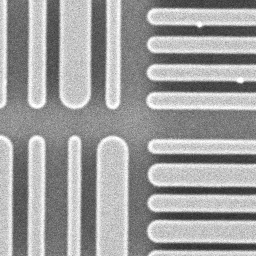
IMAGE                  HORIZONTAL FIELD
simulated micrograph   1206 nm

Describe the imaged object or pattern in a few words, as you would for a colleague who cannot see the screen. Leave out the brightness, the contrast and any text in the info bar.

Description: groups of lines, slits or small figures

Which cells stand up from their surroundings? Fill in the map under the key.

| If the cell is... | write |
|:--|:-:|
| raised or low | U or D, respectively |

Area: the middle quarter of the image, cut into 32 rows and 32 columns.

UUUUUUUDDDDUUUDDDDDDDDUUUUUUUUUU
UUUUUUUDDDDUUUDDDDDDDUUUUUUUUUUU
UUUUUUUDDDDUUUDDDDDDDUUUUUUUUUUU
UUUUUUUDDDDUUUDDDDDDDDUUUUUUUUUU
UUUUUUUDDDDUUUDDDDDDDDDDDDDDDDDD
UUUUUUUDDDDUUUDDDDDDDDDDDDDDDDDD
UUUUUUUDDDDUUUDDDDDDDDDDDDDDDDDD
UUUUUUUDDDDUUUDDDDDDDDUUUUUUUUUU
UUUUUUDDDDDUUUDDDDDDDUUUUUUUUUUU
UUUUUUDDDDDUUUDDDDDDDUUUUUUUUUUU
DUUUUDDDDDDUUDDDDDDDDUUUUUUUUUUU
DDDDDDDDDDDDDDDDDDDDDDDDDDDDDDDD
DDDDDDDDDDDDDDDDDDDDDDDDDDDDDDDD
DDDDDDDDDDDDDDDDDDDDDDDDDDDDDDDD
DDDDDDDDDDDDDDDDDDDDDDDDDDDDDDDD
DDDDDDDDDDDDDDDDDDDDDDDDDDDDDDDD
DDDDDDDDDDDDDDDDDDDDDDDDDDDDDDDD
DDDDDDDDDDDDDDDDDDDDDDDDDDDDDDDD
DDUUDDDDDDUUUUDDDDDDDDDDDDDDDDDD
DUUUDDDDDUUUUUUDDDDDDDUUUUUUUUUU
DUUUDDDDDUUUUUUUDDDDDUUUUUUUUUUU
DUUUDDDDDUUUUUUUDDDDDUUUUUUUUUUU
DUUUDDDDDUUUUUUUDDDDDDDDDDDDDDDD
DUUUDDDDDUUUUUUUDDDDDDDDDDDDDDDD
DUUUDDDDUUUUUUUUDDDDDDDDDDDDDDDD
DUUUDDDDUUUUUUUUDDDDDDDUUUUUUUUU
DUUUDDDDUUUUUUUUDDDDDUUUUUUUUUUU
DUUUDDDDUUUUUUUUDDDDDUUUUUUUUUUU
DUUUDDDDUUUUUUUUDDDDDUUUUUUUUUUU
DUUUDDDDUUUUUUUUDDDDDDUUUUUUUUUU
DUUUDDDDUUUUUUUUDDDDDDDDDDDDDDDD
DUUUDDDDUUUUUUUUDDDDDDDDDDDDDDDD